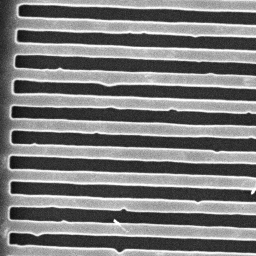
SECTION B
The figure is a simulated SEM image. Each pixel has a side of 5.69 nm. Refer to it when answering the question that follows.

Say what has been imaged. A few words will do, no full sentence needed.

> parallel lines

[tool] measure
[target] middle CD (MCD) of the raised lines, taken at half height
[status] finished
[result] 66.8 nanometres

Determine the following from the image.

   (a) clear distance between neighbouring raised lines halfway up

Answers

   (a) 78.2 nm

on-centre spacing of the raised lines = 0.144 microns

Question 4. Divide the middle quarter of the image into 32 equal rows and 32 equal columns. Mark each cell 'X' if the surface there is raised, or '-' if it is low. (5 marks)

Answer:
--------------------------------
--------------------------------
XXXXXXXXXXXXXXXXXXXXXXXXXXXXXXX-
XXXXXXXXXXXXXXXXXXXXXXXXXXXXXXXX
---XXX-XXXXXXXXXXXXXXXXXXXXXXXXX
--------------------------------
--------------------------------
--------------------------------
XXXXXXXXXXXXXXXXXXXX------------
XXXXXXXXXXXXXXXXXXXXXXXXXXXXXXXX
XXXXXXXXXXXXXXXXXXXXXXXXXXXXXXXX
----------------------XX----XXXX
--------------------------------
--------------------------------
XXXXXXXXX-----------------------
XXXXXXXXXXXXXXXXXXXXXXXXXXXXXXX-
XXXXXXXXXXXXXXXXXXXXXXXXXXXXXXXX
-----------XX----XXXXXXXXXXXXXXX
--------------------------------
--------------------------------
--------------------------------
XXXXXXXXXXXXXXXXXXXXXXXXXXXXXXX-
XXXXXXXXXXXXXXXXXXXXXXXXXXXXXXXX
------XXXXXXXXXXXXXXXXXXXXXXXXXX
-------------------------------X
--------------------------------
--------------------------------
XXXXXXXXXXXXXXXXXXXXXXX---------
XXXXXXXXXXXXXXXXXXXXXXXXXXXXXXXX
XXXXXXXXXXXXXXXXXXXXXXXXXXXXXXXX
------------------------XX-XXX-X
--------------------------------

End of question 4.